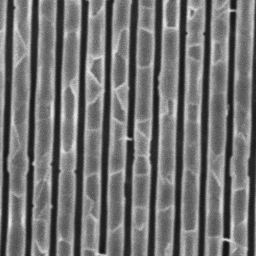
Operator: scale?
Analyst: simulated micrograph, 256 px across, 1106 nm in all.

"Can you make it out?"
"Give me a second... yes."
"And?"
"parallel lines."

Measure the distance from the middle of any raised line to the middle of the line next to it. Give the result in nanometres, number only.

107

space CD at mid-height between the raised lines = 31.8 nm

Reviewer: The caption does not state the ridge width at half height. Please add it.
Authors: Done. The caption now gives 17.6 pixels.